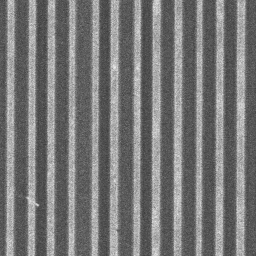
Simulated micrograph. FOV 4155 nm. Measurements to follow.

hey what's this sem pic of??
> parallel lines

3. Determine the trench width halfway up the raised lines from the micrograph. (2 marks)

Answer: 201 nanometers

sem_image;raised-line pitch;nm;340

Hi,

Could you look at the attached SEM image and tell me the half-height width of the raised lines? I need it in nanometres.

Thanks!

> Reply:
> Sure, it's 144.